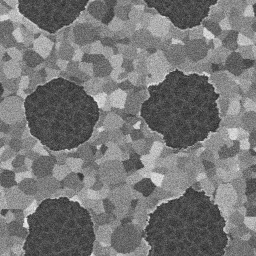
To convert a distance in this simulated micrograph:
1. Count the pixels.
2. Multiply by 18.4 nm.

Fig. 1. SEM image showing holes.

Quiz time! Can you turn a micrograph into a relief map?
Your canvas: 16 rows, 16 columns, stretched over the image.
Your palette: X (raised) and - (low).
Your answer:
X----XXXX----XXX
XX--XXXXXXX-XXXX
XXXXXXXXXXXXXXXX
XXXXXXXXXXXXXXXX
XXXXXXXXXXX-XXXX
XX---XXXX----XXX
XX----XXX-----XX
XX----XXX-----XX
XX----XXXX---XXX
XXXXXXXXXXXXXXXX
XXXXXXXXXXXXXXXX
XXXXXXXXXXXXXXXX
XXX--XXXXXX--XXX
XX----XXX-----XX
XX----XXX-----XX
X-----XXXX----XX